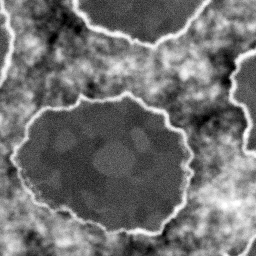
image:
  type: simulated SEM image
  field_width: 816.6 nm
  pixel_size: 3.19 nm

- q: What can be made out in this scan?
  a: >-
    raised bodies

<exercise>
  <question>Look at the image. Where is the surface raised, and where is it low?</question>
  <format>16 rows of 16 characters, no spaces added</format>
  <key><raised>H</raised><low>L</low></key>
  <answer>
LLLLLHHHHHHHHLLL
HLLLLLHHHHHHLLLL
HLLLLLLLHHLLLLLL
HLLLLLLLLLLLLLLH
LLLLLLLLLLLLLLLH
LLLLLLLLLLLLLLLH
LLLLLHHHHLLLLLLH
LLHHHHHHHHLLLLLL
LLHHHHHHHHHHLLLH
LHHHHHHHHHHHLLLL
LHHHHHHHHHHHLLLL
LHHHHHHHHHHHLLLL
LLHHHHHHHHHHLLLL
LLLLLHHHHHHLLLLL
LLLLLLLHHHLLLLLL
LLLLLLLLLLLLLLLH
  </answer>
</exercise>